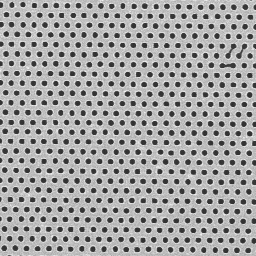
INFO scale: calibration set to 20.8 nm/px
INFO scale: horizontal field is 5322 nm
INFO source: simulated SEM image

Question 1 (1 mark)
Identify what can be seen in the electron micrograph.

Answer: a regular array of holes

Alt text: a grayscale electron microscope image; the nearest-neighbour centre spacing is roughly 223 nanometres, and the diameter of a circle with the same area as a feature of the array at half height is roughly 122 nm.